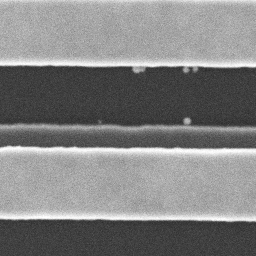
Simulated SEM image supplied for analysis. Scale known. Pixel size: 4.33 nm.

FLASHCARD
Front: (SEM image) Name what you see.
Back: lines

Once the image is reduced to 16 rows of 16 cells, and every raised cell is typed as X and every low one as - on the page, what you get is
XXXXXXXXXXXXXXXX
XXXXXXXXXXXXXXXX
XXXXXXXXXXXXXXXX
XXXXXXXXXXXXXXXX
----------------
----------------
----------------
----------------
----------------
XXXXXXXXXXXXXXXX
XXXXXXXXXXXXXXXX
XXXXXXXXXXXXXXXX
XXXXXXXXXXXXXXXX
XXXXXXXXXXXXXXXX
----------------
----------------